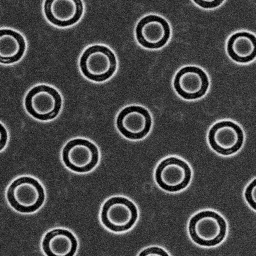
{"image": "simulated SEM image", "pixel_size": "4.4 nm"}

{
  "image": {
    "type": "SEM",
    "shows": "a regular array of ring-shaped grooves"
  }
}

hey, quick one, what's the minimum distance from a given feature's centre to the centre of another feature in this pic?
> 281 nanometers